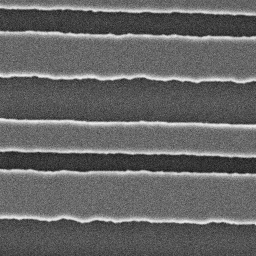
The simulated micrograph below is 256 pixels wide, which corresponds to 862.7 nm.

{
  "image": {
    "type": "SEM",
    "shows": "lines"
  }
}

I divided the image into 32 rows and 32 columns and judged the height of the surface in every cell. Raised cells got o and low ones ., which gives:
oooooooooooooooooooooooooooooooo
................oooooooooooooooo
................................
................................
oooooooooooooooooooooooo..o.....
oooooooooooooooooooooooooooooooo
oooooooooooooooooooooooooooooooo
oooooooooooooooooooooooooooooooo
oooooooooooooooooooooooooooooooo
oo..oooooooooooooooooooooooooooo
................................
................................
................................
................................
................................
oooooooooooooooooooooooooo......
oooooooooooooooooooooooooooooooo
oooooooooooooooooooooooooooooooo
oooooooooooooooooooooooooooooooo
...........................ooooo
................................
oooooooooo.oooooooooo...........
oooooooooooooooooooooooooooooooo
oooooooooooooooooooooooooooooooo
oooooooooooooooooooooooooooooooo
oooooooooooooooooooooooooooooooo
oooooooooooooooooooooooooooooooo
......o...oo.ooooooooooooooooooo
................................
................................
................................
................................